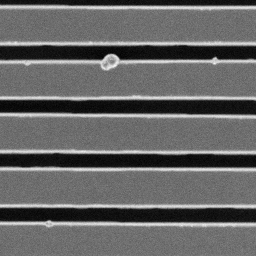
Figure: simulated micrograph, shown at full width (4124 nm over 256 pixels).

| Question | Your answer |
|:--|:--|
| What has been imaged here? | lines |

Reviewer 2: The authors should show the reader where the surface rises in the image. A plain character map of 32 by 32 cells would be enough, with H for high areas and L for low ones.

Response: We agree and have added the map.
LLLLLLLLLLLLLLLLLLLLLLLLLLLLLLLL
HHHHHHHHHHHHHHHHHHHHHHHHHHHHHHHH
HHHHHHHHHHHHHHHHHHHHHHHHHHHHHHHH
HHHHHHHHHHHHHHHHHHHHHHHHHHHHHHHH
HHHHHHHHHHHHHHHHHHHHHHHHHHHHHHHH
HHHHHHHHHHHHHHHHHHHHHHHHHHHHHHHH
LLLLLLLLLLLLLLLLLLLLLLLLLLLLLLLL
LLLLLLLLLLLLLHHLLLLLLLLLLLHHLLLL
HHHHHHHHHHHHHHHHHHHHHHHHHHHHHHHH
HHHHHHHHHHHHHHHHHHHHHHHHHHHHHHHH
HHHHHHHHHHHHHHHHHHHHHHHHHHHHHHHH
HHHHHHHHHHHHHHHHHHHHHHHHHHHHHHHH
LLLLLLLLLLLLLLLLLLLLLLLLLLLLLLLL
LLLLLLLLLLLLLLLLLLLLLLLLLLLLLLLL
HHHHHHHHHHHHHHHHHHHHHHHHHHHHHHHH
HHHHHHHHHHHHHHHHHHHHHHHHHHHHHHHH
HHHHHHHHHHHHHHHHHHHHHHHHHHHHHHHH
HHHHHHHHHHHHHHHHHHHHHHHHHHHHHHHH
HHHHHHHHHHHHHHHHHHHHHHHHHHHHHHHH
LLLLLLLLLLLLLLLLLLLLLLLLLLLLLLLL
LLLLLLLLLLLLLLLLLLLLLLLLLLLLLLLL
HHHHHHHHHHHHHHHHHHHHHHHHHHHHHHHH
HHHHHHHHHHHHHHHHHHHHHHHHHHHHHHHH
HHHHHHHHHHHHHHHHHHHHHHHHHHHHHHHH
HHHHHHHHHHHHHHHHHHHHHHHHHHHHHHHH
HHHHHHHHHHHHHHHHHHHHHHHHHHHHHHHH
LLLLLLLLLLLLLLLLLLLLLLLLLLLLLLLL
LLLLLLLLLLLLLLLLLLLLLLLLLLLLLLLL
HHHHHHHHHHHHHHHHHHHHHHHHHHHHHHHH
HHHHHHHHHHHHHHHHHHHHHHHHHHHHHHHH
HHHHHHHHHHHHHHHHHHHHHHHHHHHHHHHH
HHHHHHHHHHHHHHHHHHHHHHHHHHHHHHHH